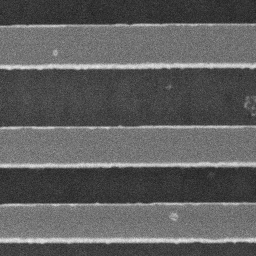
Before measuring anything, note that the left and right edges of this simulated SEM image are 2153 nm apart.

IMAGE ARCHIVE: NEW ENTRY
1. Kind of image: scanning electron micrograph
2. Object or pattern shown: lines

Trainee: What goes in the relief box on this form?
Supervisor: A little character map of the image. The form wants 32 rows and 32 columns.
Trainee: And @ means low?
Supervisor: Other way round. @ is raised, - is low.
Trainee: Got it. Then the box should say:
--------------------------------
--------------------------------
--------------------------------
@@@@@@@@@@@@@@@@@@@@@@@@@@@@@@@@
@@@@@@@@@@@@@@@@@@@@@@@@@@@@@@@@
@@@@@@@@@@@@@@@@@@@@@@@@@@@@@@@@
@@@@@@@@@@@@@@@@@@@@@@@@@@@@@@@@
@@@@@@@@@@@@@@@@@@@@@@@@@@@@@@@@
@@@@@@@@@@@@@--@@@--------------
--------------------------------
--------------------------------
--------------------------------
--------------------------------
--------------------------------
--------------------------------
--------------------------------
@@@@@@@@@@@@@@@@@@@@@@@@@@@@@@@@
@@@@@@@@@@@@@@@@@@@@@@@@@@@@@@@@
@@@@@@@@@@@@@@@@@@@@@@@@@@@@@@@@
@@@@@@@@@@@@@@@@@@@@@@@@@@@@@@@@
@@@@@@@@@@@@@@@@@@@@@@@@@@@@@@@@
--------------------------------
--------------------------------
--------------------------------
--------------------------------
------------@----@@@@@@@@@@@@@@@
@@@@@@@@@@@@@@@@@@@@@@@@@@@@@@@@
@@@@@@@@@@@@@@@@@@@@@@@@@@@@@@@@
@@@@@@@@@@@@@@@@@@@@@@@@@@@@@@@@
@@@@@@@@@@@@@@@@@@@@@@@@@@@@@@@@
--------------------------------
--------------------------------